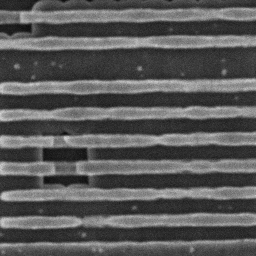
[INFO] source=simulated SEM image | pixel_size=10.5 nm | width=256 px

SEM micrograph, wiring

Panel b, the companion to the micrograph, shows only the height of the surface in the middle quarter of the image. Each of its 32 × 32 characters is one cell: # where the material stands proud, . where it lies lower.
................................
................................
................................
................................
..########..###################.
################################
#######################..###....
................................
................................
................................
................................
##########.#####################
################################
##########....#####.............
................................
................................
................................
................................
################################
.###############################
......##########................
................................
................................
................................
........#########...##..######..
...#############################
...###########################.#
.....####.......................
................................
................................
................................
.....#####.############..#####.#